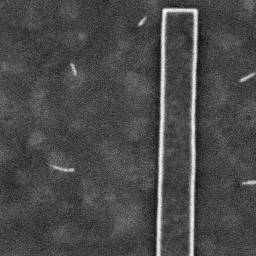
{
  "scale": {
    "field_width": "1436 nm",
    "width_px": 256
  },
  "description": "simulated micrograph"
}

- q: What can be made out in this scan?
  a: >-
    one or a few lines or trenches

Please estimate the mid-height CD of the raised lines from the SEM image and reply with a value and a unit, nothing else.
188 nm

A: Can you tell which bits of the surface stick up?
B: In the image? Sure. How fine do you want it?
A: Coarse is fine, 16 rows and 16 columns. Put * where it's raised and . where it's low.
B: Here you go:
................
..........**....
..........**....
..........**....
..........**....
..........**....
..........**....
..........**....
..........**....
..........**....
..........**....
..........**....
..........**....
..........**....
..........**....
..........**....